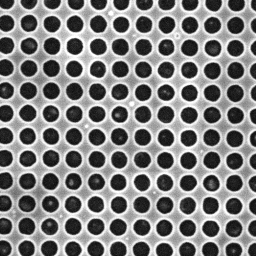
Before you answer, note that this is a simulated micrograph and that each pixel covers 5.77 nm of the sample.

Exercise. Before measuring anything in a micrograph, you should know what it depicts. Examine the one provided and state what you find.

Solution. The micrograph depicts a regular array of holes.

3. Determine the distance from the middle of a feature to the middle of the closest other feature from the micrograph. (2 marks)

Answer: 129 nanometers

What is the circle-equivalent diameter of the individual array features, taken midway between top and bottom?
17.9 px